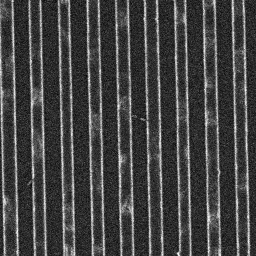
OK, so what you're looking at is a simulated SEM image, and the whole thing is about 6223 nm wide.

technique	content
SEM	parallel lines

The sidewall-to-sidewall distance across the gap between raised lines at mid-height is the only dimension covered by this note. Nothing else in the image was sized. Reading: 401 nm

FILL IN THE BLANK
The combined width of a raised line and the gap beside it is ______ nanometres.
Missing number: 705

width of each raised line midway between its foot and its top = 295 nanometres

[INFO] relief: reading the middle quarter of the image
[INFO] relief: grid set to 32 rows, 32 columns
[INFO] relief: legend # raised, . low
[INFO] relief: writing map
##....###....###.....###....###.
##....###....###.....###....###.
##....###....###.....###....###.
##....###....###.....###....###.
##....###....###.....###....###.
##....###....###.....###....###.
##....###....###.....###....###.
##....###....###.....###....###.
##....###....###.....###....###.
##....###....###.....###....###.
##....###....####....###....###.
##....###.....###....###....###.
##....###.....###....###....###.
##....###.....###....###....###.
##....###.....###....###....###.
##....###.....###....###....###.
##....###.....###....###....###.
##....###.....###....###....###.
##.....##.....###....###....###.
##.....##.....###....###....###.
##.....##.....###....###....###.
##.....##.....###....###....###.
##.....##.....###....###.....##.
##.....##.....###....###.....##.
##.....##.....###....###.....##.
##.....##.....###....###.....##.
##.....##.....###....###.....##.
##.....###....###....###.....##.
##.....###....###....###.....##.
##.....###....###....###.....##.
##.....###....###....###.....##.
##.....###....###....###.....##.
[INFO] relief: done